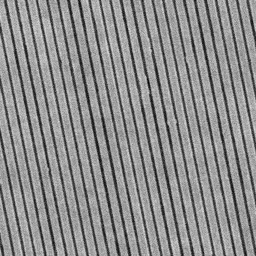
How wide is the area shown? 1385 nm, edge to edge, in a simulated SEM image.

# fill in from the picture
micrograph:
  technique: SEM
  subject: parallel lines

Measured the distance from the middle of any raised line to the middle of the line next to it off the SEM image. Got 55.9 nm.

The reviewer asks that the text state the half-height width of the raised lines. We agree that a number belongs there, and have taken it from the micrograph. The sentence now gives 37.8 nanometres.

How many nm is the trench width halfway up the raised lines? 18.6